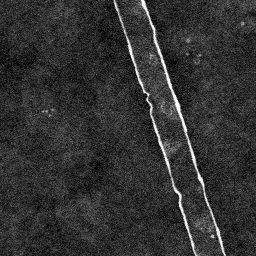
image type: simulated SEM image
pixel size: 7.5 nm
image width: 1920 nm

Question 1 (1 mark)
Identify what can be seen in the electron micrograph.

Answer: one or a few lines or trenches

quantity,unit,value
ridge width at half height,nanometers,208